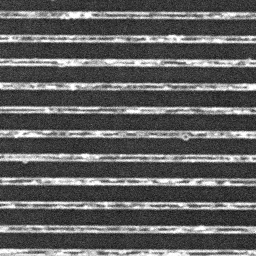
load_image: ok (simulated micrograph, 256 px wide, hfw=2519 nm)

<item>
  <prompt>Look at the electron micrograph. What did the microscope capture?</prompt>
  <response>parallel lines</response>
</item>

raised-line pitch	0.234	µm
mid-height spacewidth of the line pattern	176	nm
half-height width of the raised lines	5.62	pixels